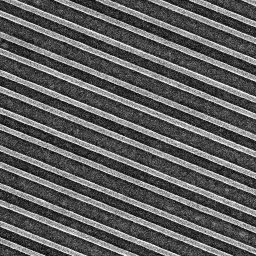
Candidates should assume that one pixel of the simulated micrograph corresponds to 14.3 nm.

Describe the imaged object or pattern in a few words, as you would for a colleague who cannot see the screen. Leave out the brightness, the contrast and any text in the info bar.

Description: parallel lines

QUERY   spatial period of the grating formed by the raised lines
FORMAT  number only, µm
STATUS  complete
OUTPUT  0.251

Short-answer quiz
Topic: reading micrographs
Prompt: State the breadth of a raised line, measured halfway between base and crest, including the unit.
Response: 5.22 pixels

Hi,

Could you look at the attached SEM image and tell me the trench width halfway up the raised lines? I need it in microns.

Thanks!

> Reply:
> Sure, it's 0.161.